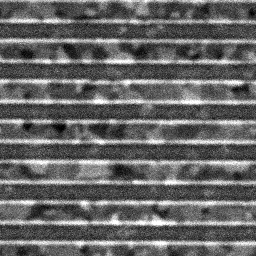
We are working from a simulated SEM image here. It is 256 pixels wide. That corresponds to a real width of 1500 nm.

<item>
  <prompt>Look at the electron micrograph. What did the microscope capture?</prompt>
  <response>parallel lines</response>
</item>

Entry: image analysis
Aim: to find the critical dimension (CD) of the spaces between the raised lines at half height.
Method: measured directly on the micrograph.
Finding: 111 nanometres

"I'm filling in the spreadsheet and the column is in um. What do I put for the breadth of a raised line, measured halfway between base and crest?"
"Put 0.122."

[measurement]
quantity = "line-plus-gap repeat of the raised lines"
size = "236 nm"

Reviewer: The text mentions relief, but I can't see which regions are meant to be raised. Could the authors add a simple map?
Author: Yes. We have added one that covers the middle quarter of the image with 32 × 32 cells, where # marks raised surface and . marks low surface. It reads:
................................
................................
................................
................................
######........##################
################################
################################
################################
################################
##...##.....................####
................................
................................
................................
................................
#########.........##............
################################
################################
################################
################################
...................#############
................................
................................
................................
................................
...###..........................
################################
################################
################################
################################
#########..#####################
................................
................................